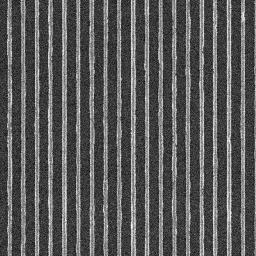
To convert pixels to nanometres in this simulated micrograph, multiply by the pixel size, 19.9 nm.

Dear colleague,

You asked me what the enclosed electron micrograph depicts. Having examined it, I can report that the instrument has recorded parallel lines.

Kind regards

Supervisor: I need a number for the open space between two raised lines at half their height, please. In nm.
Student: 213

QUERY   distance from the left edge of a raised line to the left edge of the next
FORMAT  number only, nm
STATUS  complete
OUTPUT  272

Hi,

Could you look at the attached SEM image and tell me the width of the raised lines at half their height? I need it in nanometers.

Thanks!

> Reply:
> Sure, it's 72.